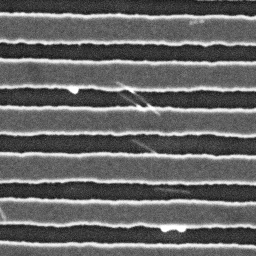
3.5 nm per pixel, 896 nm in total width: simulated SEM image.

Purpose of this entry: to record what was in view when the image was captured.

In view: lines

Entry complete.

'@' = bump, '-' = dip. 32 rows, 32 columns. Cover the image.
--------------------------------
--------------------------------
@@@@@@@@@@@@@@@@@@@@@@@@@@@@@@@@
@@@@@@@@@@@@@@@@@@@@@@@@@@@@@@@@
@@@@@@@@@@@@@@@@@@@@@@@@@@@@@@@@
-------------@-----@@@@-@@@@@@@@
--------------------------------
@-@@@@--------------------------
@@@@@@@@@@@@@@@@@@@@@@@@@@@@@@@@
@@@@@@@@@@@@@@@@@@@@@@@@@@@@@@@@
@@@@@@@@@@@@@@@@@@@@@@@@@@@@@@@@
--------------------------------
--------------------------------
@@@@@@@@@@@---@@@@@@------------
@@@@@@@@@@@@@@@@@@@@@@@@@@@@@@@@
@@@@@@@@@@@@@@@@@@@@@@@@@@@@@@@@
@@@@@@@@@@@@@@@@@@@@@@@@@@@@@@@@
--------------------------------
--------------------------------
@@@@@@@@@@@@@@@@@@@@@@@@@@---@--
@@@@@@@@@@@@@@@@@@@@@@@@@@@@@@@@
@@@@@@@@@@@@@@@@@@@@@@@@@@@@@@@@
@@@@@@@@@@@@@@@@@@@@@@@@@@@@@@@@
--------------------------------
--------------------------------
@@@@@@@@@@@@@@@@@@@@@@@@@@@@@@@@
@@@@@@@@@@@@@@@@@@@@@@@@@@@@@@@@
@@@@@@@@@@@@@@@@@@@@@@@@@@@@@@@@
--------------------@-@---------
--------------------------------
@@@@@@-@@@@@---@@---------------
@@@@@@@@@@@@@@@@@@@@@@@@@@@@@@@@